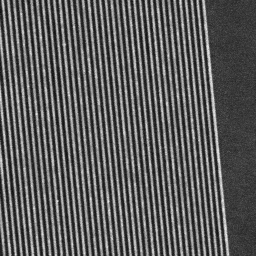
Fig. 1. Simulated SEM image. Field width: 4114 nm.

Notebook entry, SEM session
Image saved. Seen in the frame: parallel lines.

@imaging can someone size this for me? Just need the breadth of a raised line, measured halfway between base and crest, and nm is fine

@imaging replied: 32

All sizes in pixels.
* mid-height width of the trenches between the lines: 3.86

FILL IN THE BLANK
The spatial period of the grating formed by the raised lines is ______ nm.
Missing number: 91.6